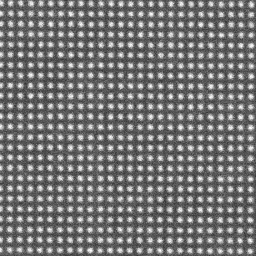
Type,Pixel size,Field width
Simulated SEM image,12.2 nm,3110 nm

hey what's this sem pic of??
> a regular array of raised bodies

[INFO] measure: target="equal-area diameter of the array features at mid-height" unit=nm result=59.8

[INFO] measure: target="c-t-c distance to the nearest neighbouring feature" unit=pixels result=9.77